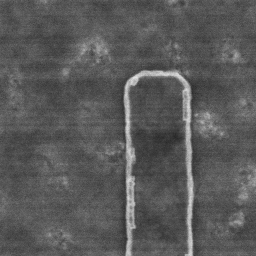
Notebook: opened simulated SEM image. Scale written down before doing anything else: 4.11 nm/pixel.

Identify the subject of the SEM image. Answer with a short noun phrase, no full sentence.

one or a few lines or trenches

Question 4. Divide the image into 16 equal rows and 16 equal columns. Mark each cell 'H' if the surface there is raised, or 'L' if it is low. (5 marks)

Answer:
LLLLLLLLLLLLLLLL
LLLLLLLLLLLLLLLL
LLLLLLLLLLLLLLLL
LLLLLLLLLLLLLLLL
LLLLLLLLLLLLLLLL
LLLLLLLLHHHHLLLL
LLLLLLLLHHHHLLLL
LLLLLLLLHHHHLLLL
LLLLLLLLHHHHLLLL
LLLLLLLLHHHHLLLL
LLLLLLLLHHHHLLLL
LLLLLLLLHHHHLLLL
LLLLLLLLHHHHLLLL
LLLLLLLLHHHHLLLL
LLLLLLLLHHHHLLLL
LLLLLLLLHHHHLLLL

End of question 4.